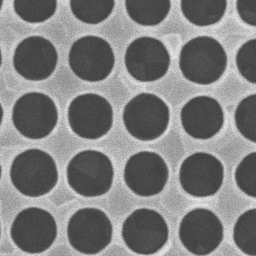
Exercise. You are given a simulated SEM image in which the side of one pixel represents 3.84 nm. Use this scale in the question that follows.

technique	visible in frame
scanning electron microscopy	a regular array of holes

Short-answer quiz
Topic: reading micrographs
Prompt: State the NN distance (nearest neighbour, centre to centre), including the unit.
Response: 214 nm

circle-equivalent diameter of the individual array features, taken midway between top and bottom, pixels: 46